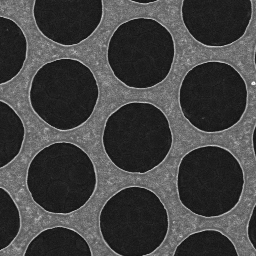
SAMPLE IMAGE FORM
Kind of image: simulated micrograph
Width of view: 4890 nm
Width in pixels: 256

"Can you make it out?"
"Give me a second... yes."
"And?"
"holes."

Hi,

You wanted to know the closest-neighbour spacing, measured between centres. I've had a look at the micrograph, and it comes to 1.61 µm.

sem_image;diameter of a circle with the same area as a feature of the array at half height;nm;1320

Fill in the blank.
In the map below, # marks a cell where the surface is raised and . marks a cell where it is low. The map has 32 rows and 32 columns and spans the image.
####.........##########........#
####.........##########........#
.###.........###...####........#
..###.......###......##........#
...###.....###.......###......##
...#####.#####........###....###
...##########.........##########
...####..####.........##########
...##......###.......###.....###
..##........##.......##.......##
####........####....###........#
####........###########........#
####........##########.........#
.###........###.....###........#
..###......###.......##.......##
...###....###........###.....###
...##########........###########
...##########........###########
...###....###........####...####
..##.......###.......##......###
.###........##......###.......##
###.........####..####........##
###.........##########........##
####........####..####........##
.###.......###......##........##
..###......##.......###.......##
..####...####........###....####
...#########.........##########.
..#####.#####........##########.
..###.....###........###....###.
.###.......##.......###......###
###........###.....###........##